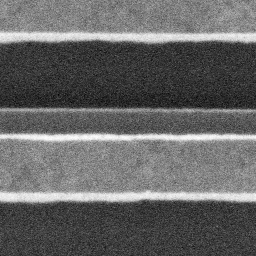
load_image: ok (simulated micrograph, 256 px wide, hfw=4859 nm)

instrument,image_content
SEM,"lines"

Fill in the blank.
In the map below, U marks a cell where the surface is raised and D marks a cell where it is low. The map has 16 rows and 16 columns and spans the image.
UUUUUUUUUUUUUUUU
UUUUUUUUUUUUUUUU
DDDDDDDDDDDDDDDD
DDDDDDDDDDDDDDDD
DDDDDDDDDDDDDDDD
DDDDDDDDDDDDDDDD
DDDDDDDDDDDDDDDD
UUUUUUUUUUUUUUUU
UUUUUUUUUUUUUUUU
UUUUUUUUUUUUUUUU
UUUUUUUUUUUUUUUU
UUUUUUUUUUUUUUUU
DDDDDDDDDDDDDDDD
DDDDDDDDDDDDDDDD
DDDDDDDDDDDDDDDD
DDDDDDDDDDDDDDDD